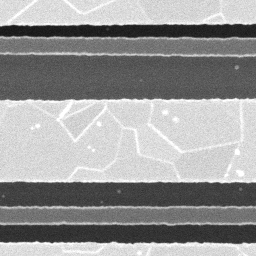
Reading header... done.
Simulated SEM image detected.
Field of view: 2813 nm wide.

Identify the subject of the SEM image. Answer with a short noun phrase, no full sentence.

lines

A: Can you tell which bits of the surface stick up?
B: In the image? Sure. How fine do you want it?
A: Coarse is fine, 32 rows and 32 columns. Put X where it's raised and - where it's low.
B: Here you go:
XXXXXXXXXXXXXXXXXXXXXXXXXXXXXXXX
XXXXXXXXXXXXXXXXXXXXXXXXXXXXXXXX
XXXXXXXXXXXXXXXXXXXXXXXXXXXXXXXX
--------------------------------
--------------------------------
XXXXXXXXXXXXXXXXXXXXXXXXXXXXXXXX
XXXXXXXXXXXXXXXXXXXXXXXXXXXXXXXX
--------------------------------
--------------------------------
--------------------------------
--------------------------------
--------------------------------
---------------XX-XX--X--XXXXXXX
XXXXXXXXXXXXXXXXXXXXXXXXXXXXXXXX
XXXXXXXXXXXXXXXXXXXXXXXXXXXXXXXX
XXXXXXXXXXXXXXXXXXXXXXXXXXXXXXXX
XXXXXXXXXXXXXXXXXXXXXXXXXXXXXXXX
XXXXXXXXXXXXXXXXXXXXXXXXXXXXXXXX
XXXXXXXXXXXXXXXXXXXXXXXXXXXXXXXX
XXXXXXXXXXXXXXXXXXXXXXXXXXXXXXXX
XXXXXXXXXXXXXXXXXXXXXXXXXXXXXXXX
XXXXXXXXXXXXXXXXXXXXXXXXXXXXXXXX
XXXXXXXXXXXXXXXXXXXXXXXXXXXXXXXX
--------------------------------
--------------------------------
--------------------------------
XXXXXXXXXXXXXXXXXXXXXXXXXXXXXXXX
XXXXXXXXXXXXXXXXXXXXXXXXXXXXXXXX
--------------------------------
--------------------------------
XXXXXXXXXXXXXXXXXXXXXXXXXXXXX-XX
XXXXXXXXXXXXXXXXXXXXXXXXXXXXXXXX